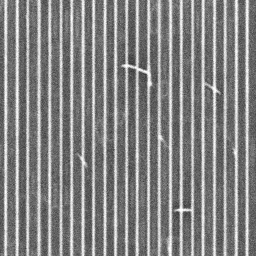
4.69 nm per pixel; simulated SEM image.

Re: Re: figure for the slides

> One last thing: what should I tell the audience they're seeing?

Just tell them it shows parallel lines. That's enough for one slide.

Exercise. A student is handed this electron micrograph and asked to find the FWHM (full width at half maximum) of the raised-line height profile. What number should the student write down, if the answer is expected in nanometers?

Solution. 8.2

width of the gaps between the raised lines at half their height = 42.2 nanometres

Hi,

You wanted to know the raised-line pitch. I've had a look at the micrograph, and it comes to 11 px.